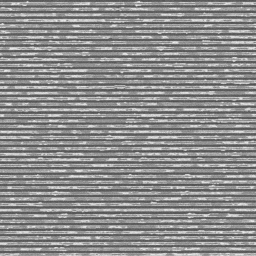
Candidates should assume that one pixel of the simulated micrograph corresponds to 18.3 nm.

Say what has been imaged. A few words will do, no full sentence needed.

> parallel lines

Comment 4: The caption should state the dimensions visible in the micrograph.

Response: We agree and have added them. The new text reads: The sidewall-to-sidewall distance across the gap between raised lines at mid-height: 48.1 nm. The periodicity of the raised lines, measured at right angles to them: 102 nanometers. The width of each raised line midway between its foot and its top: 50.4 nanometers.